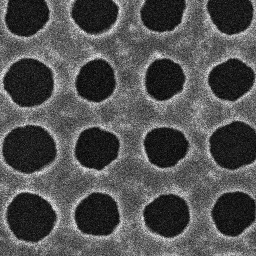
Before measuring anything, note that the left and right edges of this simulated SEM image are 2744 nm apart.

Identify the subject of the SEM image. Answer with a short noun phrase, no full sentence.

a regular array of holes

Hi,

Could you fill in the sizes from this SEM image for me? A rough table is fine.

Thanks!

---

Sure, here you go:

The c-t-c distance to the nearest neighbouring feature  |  0.715 µm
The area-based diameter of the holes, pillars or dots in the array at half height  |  482 nm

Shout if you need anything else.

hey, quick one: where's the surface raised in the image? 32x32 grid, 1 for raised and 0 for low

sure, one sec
10000011100000111100000111000000
10000011100000011000000111000000
10000011100000111100000111000000
10000111110000111100001111100001
11001111111111111111111111111111
11111111111111111111111111111111
11111111111111111111111111111111
11000111111101111111011111110011
10000011110000111100000111100001
10000001110000111100000111000000
00000001100000111100000111000000
10000001110000111100001111100001
11000011111001111111011111110011
11111111111111111111111111111111
11111111111111111111111111111111
11111111111111111111111111110001
10000011110000111110000111100000
00000001110000011100000111000000
00000001100000011100000011000000
00000001100000011100000111000000
10000011110000111110001111100001
11001111111111111111111111111111
11111111111111111111111111111111
11111111111111111111111111111111
11000111111000111111001111110001
10000011110000011110000111100000
10000001100000011100000011000000
10000001100000011100000011100000
10000001110000011100000111100001
11000011111101111111001111110011
11111111111111111111111111111111
11111111111111111111111111111111